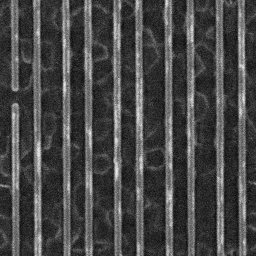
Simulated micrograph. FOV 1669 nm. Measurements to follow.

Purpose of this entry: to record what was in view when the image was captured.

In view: parallel lines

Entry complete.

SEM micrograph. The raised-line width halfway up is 39.9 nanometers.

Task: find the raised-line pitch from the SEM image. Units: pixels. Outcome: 25.2